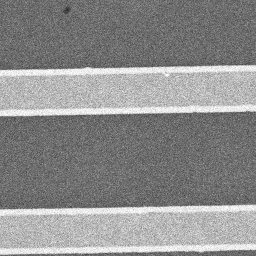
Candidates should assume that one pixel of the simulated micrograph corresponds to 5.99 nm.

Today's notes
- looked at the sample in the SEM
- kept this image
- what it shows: one or a few lines or trenches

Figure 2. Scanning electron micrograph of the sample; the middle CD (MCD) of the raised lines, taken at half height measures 238 nm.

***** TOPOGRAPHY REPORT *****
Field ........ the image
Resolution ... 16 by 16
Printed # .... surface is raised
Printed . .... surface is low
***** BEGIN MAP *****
................
................
................
................
....############
################
################
................
................
................
................
................
................
################
################
##########..#...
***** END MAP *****